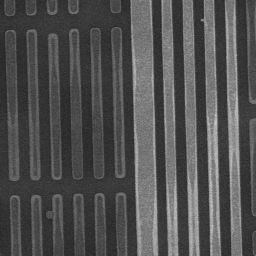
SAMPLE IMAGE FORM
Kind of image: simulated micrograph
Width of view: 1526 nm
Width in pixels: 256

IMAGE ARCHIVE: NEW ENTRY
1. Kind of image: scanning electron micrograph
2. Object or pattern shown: groups of lines, slits or small figures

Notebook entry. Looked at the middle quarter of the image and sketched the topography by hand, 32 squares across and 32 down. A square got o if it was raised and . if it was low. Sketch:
..oo...oo...oo...ooooo...oo...oo
..oo...oo...oo....oooo...oo...oo
..oo...oo...oo....oooo...oo...oo
..oo...oo....o....oooo...oo...oo
..oo...oo....o....oooo...oo...oo
..oo...oo....o....oooo...oo...oo
..oo...oo....o....oooo...oo...oo
..oo...oo....o....oooo...oo...oo
..oo...oo....o....oooo...oo...oo
..oo...oo....o....oooo...oo...oo
..oo...oo....oo...oooo...oo...oo
..oo...oo....oo...oooo...oo...oo
..oo...oo....oo...oooo...oo...oo
..oo...oo....oo...oooo...oo...oo
..oo...oo....oo...oooo...ooo..oo
..oo...ooo...oo...oooo...ooo...o
..oo...ooo...oo...oooo...ooo...o
..oo...ooo...oo...oooo...ooo...o
..oo...ooo...oo...oooo...ooo...o
..oo...ooo...oo...oooo...ooo...o
..oo...ooo...oo...oooo...ooo...o
..oo...ooo...oo...ooooo..ooo...o
..oo....oo...oo...ooooo..ooo...o
..oo....oo...oo...ooooo..ooo...o
..oo....oo...oo...ooooo...oo...o
..oo....oo...oo...ooooo...oo...o
..ooo...oo...oo...ooooo...oo...o
..ooo...oo...oo...ooooo...oo...o
...o....o.........ooooo...oo...o
..................ooooo...oo...o
..................ooooo...oo...o
..................ooooo...oo...o